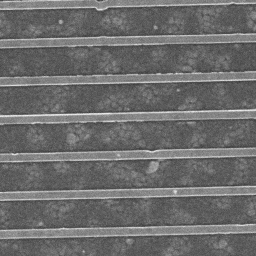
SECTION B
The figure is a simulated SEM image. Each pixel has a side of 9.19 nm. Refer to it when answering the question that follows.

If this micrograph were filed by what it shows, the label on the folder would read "parallel lines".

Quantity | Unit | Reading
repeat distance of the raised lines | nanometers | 350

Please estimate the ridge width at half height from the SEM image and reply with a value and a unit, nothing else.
71.2 nm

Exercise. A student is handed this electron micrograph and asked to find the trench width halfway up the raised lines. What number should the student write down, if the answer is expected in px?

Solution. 30